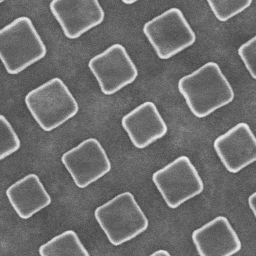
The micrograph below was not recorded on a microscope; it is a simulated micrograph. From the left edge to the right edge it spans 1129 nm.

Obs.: a regular array of raised bodies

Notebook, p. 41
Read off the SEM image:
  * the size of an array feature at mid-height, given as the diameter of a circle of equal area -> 193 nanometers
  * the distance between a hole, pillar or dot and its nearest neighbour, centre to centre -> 0.292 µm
